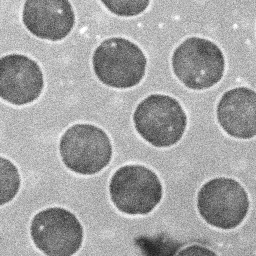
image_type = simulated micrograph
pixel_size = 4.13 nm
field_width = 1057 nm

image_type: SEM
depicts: holes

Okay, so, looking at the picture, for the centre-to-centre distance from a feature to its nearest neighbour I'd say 284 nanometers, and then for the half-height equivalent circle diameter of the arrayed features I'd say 219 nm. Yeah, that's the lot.